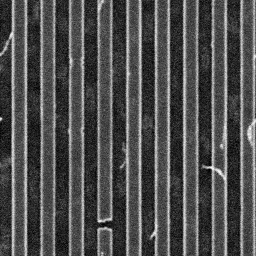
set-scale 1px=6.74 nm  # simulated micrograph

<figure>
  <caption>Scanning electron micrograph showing parallel lines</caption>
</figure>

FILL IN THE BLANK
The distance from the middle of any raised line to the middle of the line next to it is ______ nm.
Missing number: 192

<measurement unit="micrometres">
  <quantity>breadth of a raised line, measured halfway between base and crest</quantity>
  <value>0.091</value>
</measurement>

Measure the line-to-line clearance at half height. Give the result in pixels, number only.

14.5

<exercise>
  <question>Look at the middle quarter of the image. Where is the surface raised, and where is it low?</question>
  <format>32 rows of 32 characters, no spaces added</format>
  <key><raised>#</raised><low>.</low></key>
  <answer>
..###....###....###....###....##
..###....###....###....###....##
..###....###....###....###....##
..###....###....###....###....##
..###....###....###....###....##
..###....###....###....###....##
..###....###....###....###....##
..###....###....###....###....##
..###....###....###....###....##
..###....###....###....###....##
..###....###....###....###....##
..###....###....###....###....##
..###....###....###....###....##
..###....###....###....###....##
..###....###....###....###....##
..###....###....###....###....##
.####....###....###....###....##
.####....###....###....###....##
..###....###....###....###....##
..###....###....###....###....##
..###....###....###....###....##
..###....###....###....###....##
..###....###....###....###....##
..###....###....###....###....##
..###....###....###....###....##
..###....###....###....###....##
..###....###....###....###....##
..###....###....###....###....##
..###....###....###....###....##
..###....###....###....###....##
.####....###....###....###....##
.####....###....###....###....##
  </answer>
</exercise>